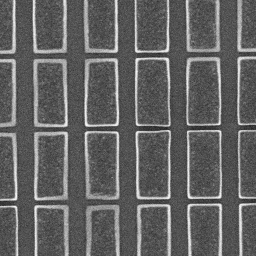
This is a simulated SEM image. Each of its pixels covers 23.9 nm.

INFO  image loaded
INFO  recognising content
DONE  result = wiring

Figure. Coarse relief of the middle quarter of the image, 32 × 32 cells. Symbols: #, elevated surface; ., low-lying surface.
......#######.....########.....#
......#######.....########.....#
......#######.....########.....#
......#######.....########.....#
......#######.....########.....#
......#######.....########.....#
......#######.....########.....#
......#######.....########.....#
......#######.....########.....#
......#######.....########.....#
......#######.....########.....#
......#######.....########.....#
......#######.....########.....#
......#######.....########.....#
#.....#######.....#########....#
................................
................................
......#######.....#########....#
#.....#######.....#########....#
......#######.....#########....#
......#######.....########.....#
......#######.....########.....#
......#######.....########.....#
......#######.....########.....#
......#######.....########.....#
......#######.....########.....#
......#######.....########.....#
......#######.....########.....#
......#######.....########.....#
......#######.....########.....#
......#######.....########.....#
......#######.....########.....#